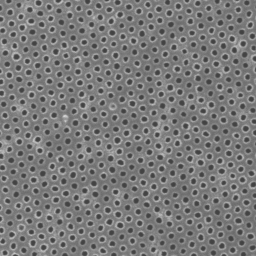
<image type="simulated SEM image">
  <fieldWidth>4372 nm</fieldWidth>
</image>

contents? a regular array of holes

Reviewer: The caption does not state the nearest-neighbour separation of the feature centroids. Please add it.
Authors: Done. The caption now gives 0.185 µm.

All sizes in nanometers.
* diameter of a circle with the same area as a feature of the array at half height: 94.4